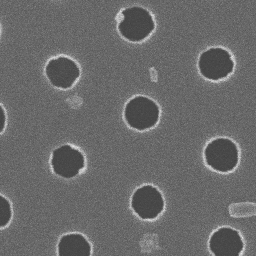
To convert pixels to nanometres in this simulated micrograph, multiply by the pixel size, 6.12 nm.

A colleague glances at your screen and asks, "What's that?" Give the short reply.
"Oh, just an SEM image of holes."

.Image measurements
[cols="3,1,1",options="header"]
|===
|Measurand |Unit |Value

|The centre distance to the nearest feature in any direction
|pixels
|88.2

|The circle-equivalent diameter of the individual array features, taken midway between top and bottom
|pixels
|32.5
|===